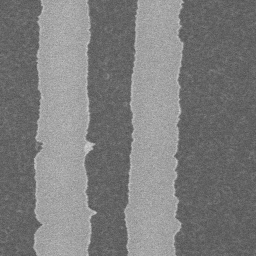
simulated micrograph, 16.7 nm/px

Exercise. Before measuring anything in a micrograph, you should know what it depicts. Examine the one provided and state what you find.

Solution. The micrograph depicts one or a few lines or trenches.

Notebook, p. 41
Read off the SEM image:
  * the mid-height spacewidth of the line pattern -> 0.747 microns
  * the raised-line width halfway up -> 795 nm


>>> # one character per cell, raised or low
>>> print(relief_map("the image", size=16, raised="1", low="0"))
0001100001100000
0011110001100000
0011110011100000
0011100011100000
0011100011100000
0011100011100000
0001110011100000
0011110011100000
0011100011100000
0011110011100000
0011100011100000
0011100011100000
0011100011100000
0011110011100000
0011110011100000
0011110011100000